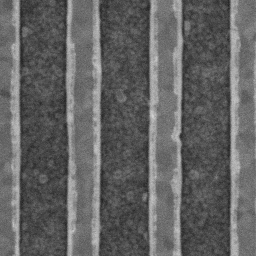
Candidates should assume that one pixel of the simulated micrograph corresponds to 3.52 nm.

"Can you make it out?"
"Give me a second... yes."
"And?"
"one or a few lines or trenches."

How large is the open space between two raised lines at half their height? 183 nanometres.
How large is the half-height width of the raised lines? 28.2 px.